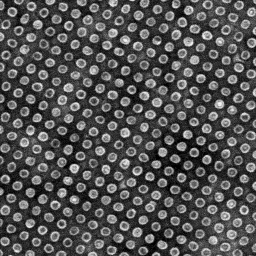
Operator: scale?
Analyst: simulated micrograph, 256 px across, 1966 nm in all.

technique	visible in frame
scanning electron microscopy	a regular array of raised bodies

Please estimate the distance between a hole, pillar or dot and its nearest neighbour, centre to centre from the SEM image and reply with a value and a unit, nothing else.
104 nanometres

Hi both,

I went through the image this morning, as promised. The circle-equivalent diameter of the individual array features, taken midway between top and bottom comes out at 64.3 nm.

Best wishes